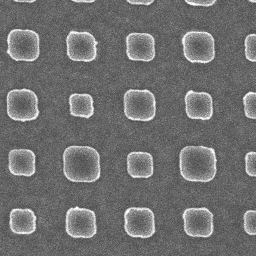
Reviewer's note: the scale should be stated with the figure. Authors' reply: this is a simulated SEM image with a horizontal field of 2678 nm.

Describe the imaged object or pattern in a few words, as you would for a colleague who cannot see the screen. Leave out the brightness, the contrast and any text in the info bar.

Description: a regular array of raised bodies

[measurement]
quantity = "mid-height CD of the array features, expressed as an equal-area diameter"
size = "0.334 µm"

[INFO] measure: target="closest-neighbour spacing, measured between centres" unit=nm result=605